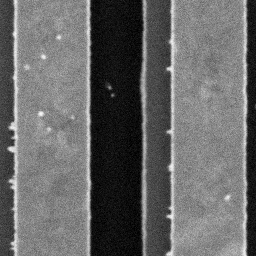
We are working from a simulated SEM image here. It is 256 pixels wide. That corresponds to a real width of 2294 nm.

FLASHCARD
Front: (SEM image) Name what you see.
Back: lines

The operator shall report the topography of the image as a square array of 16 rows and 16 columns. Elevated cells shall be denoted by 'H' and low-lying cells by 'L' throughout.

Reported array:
HHHHHHLLLHHHHHHL
HHHHHHLLLHHHHHHL
HHHHHHLLLHHHHHHL
HHHHHHLLLHHHHHHL
HHHHHHLLLHHHHHHL
HHHHHHLLLHHHHHHL
HHHHHHLLLHHHHHHL
HHHHHHLLLHHHHHHL
HHHHHHLLLHHHHHHL
HHHHHHLLLHHHHHHL
HHHHHHLLLHHHHHHL
HHHHHHLLLHHHHHHL
HHHHHHLLLHHHHHHL
HHHHHHLLLHHHHHHL
HHHHHHLLLHHHHHHL
HHHHHHLLLHHHHHHL